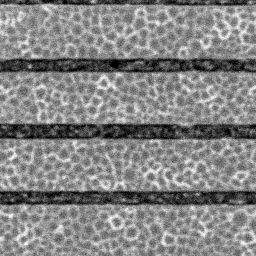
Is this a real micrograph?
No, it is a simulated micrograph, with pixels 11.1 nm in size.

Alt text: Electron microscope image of one or a few lines or trenches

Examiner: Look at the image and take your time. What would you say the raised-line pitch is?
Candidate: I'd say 738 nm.